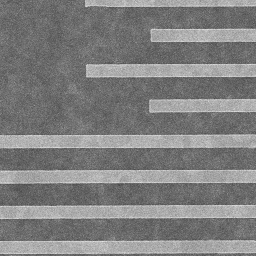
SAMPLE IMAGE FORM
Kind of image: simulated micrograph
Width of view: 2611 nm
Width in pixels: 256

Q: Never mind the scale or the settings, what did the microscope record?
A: parallel lines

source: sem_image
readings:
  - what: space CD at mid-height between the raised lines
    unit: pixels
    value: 22.9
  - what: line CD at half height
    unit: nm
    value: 125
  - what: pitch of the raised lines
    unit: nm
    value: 360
